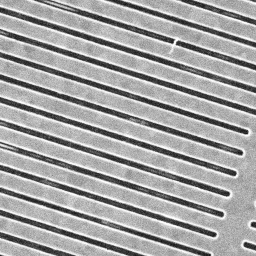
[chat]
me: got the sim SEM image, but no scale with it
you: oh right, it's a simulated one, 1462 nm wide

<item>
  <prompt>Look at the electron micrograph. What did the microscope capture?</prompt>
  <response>parallel lines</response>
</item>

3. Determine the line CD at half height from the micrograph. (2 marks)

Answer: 81.7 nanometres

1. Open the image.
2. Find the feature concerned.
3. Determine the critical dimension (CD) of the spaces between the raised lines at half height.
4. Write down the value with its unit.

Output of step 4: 38.1 nm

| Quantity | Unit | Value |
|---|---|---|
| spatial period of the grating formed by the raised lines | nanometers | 123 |